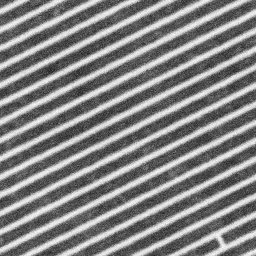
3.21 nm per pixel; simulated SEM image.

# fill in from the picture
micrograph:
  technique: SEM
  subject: parallel lines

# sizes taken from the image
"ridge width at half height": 15.7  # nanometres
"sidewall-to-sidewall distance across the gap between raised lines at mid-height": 0.0376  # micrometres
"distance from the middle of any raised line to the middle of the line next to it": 52.7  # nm